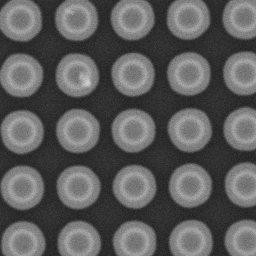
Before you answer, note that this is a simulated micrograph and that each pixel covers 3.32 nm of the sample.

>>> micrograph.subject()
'an array of small figures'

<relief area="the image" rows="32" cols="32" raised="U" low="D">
DUUUDDDDUUUUDDDUUUUDDDUUUUDDUUUU
UUUUUDDUUUUUDDUUUUUDDUUUUUDDUUUU
UUUUUDDUUUUUDDUUUUUDDUUUUUDDUUUU
UUUUUDDUUUUUDDUUUUUDDUUUUUDDUUUU
DUUUDDDDUUUDDDDUUUDDDDUUUDDDDUUU
DDDDDDDDDDDDDDDDDDDDDDDDDDDDDDDD
DDDDDDDDDDDDDDDDDDDDDDDDDDDDDDDD
DUUUDDDDUUUDDDDUUUUDDDUUUUDDUUUU
UUUUUDDUUUUUDDUUUUUDDUUUUUDDUUUU
UUUUUDDUUUUUDDUUUUUDDUUUUUDDUUUU
UUUUUDDUUUUUDDUUUUUDDUUUUUDDUUUU
DUUUDDDDUUUDDDDUUUDDDDUUUDDDDUUU
DDDDDDDDDDDDDDDDDDDDDDDDDDDDDDDD
DDDDDDDDDDDDDDDDDDDDDDDDDDDDDDUD
DUUUUDDDUUUUDDDUUUUDDDUUUUDDDUUU
UUUUUDDUUUUUDDUUUUUDDUUUUUDDUUUU
UUUUUDDUUUUUDDUUUUUDDUUUUUDDUUUU
UUUUUDDUUUUUDDUUUUUDDUUUUUDDUUUU
DUUUDDDDUUUDDDDUUUDDDDUUUDDDDUUU
DDDDDDDDDDDDDDDDDDDDDDDDDDDDDDDD
DDDDDDDDDDDDDDDDDDDDDDDDDDDDDDUU
DUUUUDDDUUUUDDDUUUUDDDUUUUDDDUUU
UUUUUDDUUUUUDDUUUUUDDUUUUUDDUUUU
UUUUUDDUUUUUDDUUUUUDDUUUUUDDUUUU
UUUUUDDUUUUUDDUUUUUDDUUUUUDDUUUU
DUUUUDDDUUUDDDDUUUDDDDUUUDDDDUUU
DDDDDDDDDDDDDDDDDDDDDDDDDDDDDDDD
DDDDDDDDDDDDDDDDDDDDDDDDDDDDDDDD
DUUUUDDDUUUUDDDUUUUDDDUUUUDDDUUU
UUUUUDDUUUUUDDUUUUUDDUUUUUDDUUUU
UUUUUUDUUUUUUDUUUUUDDUUUUUUDUUUU
UUUUUDDUUUUUDDUUUUUDDUUUUUDDDUUU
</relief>